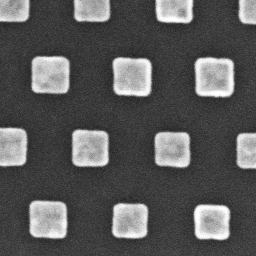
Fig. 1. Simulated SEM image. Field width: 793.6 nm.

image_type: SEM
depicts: a regular array of raised bodies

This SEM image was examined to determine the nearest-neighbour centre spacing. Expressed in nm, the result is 254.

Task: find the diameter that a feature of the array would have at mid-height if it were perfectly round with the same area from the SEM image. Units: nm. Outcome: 120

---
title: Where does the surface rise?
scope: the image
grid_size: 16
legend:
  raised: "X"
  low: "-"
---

XX---XX---XX---X
----------------
----------------
----------------
--XX---XX---XXX-
--XX---XX---XXX-
----------------
----------------
XX---XX---XX---X
XX---XX---XX---X
----------------
----------------
----------------
--XX---XX---XX--
--XX---XX---XX--
----------------